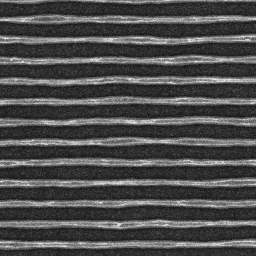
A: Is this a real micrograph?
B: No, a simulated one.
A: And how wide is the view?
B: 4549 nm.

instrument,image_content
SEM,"parallel lines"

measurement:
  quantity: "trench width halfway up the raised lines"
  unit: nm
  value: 266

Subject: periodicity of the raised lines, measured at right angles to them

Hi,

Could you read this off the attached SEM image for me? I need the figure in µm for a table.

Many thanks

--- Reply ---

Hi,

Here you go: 0.363